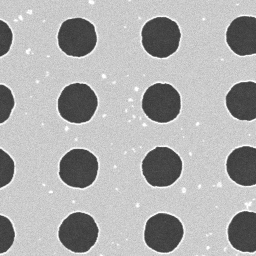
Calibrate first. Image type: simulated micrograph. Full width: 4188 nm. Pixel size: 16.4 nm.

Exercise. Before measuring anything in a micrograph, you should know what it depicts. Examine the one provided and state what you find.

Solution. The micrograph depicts a regular array of holes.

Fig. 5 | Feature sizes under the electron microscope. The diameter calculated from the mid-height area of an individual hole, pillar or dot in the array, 39.9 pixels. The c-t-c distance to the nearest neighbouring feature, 1060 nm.